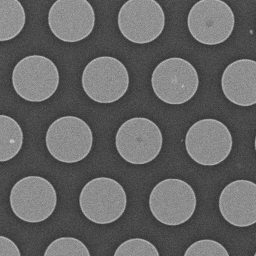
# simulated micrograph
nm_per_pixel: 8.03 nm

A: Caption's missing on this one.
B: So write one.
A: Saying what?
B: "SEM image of an array of small figures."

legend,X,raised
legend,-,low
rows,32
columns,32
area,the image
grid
XXX----XXXX-----XXXX-----XXX----
XXX---XXXXXX---XXXXX----XXXXX---
XXX---XXXXXX---XXXXX----XXXXX---
XXX---XXXXXX---XXXXX----XXXXX---
XX-----XXXX-----XXXX----XXXXX---
--------------------------X-----
--------------------------------
---XXX------XXX------XX-------X-
--XXXXX----XXXXX----XXXX----XXXX
--XXXXX---XXXXXX---XXXXXX---XXXX
--XXXXX---XXXXXX---XXXXXX---XXXX
--XXXXX----XXXXX---XXXXX----XXXX
---XX-------XXX-----XXX------XXX
--------------------------------
X-------------------------------
XX-----XXXX----XXXX-----XXXX----
XXX---XXXXX----XXXXX---XXXXXX---
XXX---XXXXXX---XXXXX---XXXXXX---
XXX---XXXXX----XXXXX---XXXXXX---
XX-----XXXX----XXXXX----XXXX----
-------------------------XX-----
--------------------------------
---XXX------XX-------X----------
--XXXXX---XXXXX----XXXXX----XXXX
-XXXXXX---XXXXXX---XXXXX----XXXX
-XXXXXX---XXXXXX---XXXXX---XXXXX
--XXXXX---XXXXX----XXXXX----XXXX
---XX------XXX------XXX-----XXXX
--------------------------------
--------------------------------
XX----XXXX-----XXXX-----XXX-----
XX----XXXXX---XXXXXX---XXXXX----